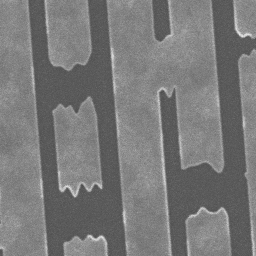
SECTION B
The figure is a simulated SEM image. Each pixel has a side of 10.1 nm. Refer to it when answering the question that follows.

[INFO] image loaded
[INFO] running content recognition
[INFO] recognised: parallel lines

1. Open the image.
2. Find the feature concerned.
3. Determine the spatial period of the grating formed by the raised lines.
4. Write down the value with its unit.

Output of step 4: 631 nm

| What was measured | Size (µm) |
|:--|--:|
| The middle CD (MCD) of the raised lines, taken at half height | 0.429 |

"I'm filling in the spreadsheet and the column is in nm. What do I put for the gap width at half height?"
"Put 199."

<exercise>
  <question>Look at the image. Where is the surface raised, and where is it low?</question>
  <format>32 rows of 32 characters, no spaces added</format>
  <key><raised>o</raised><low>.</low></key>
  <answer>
ooo...ooooo..oooooo..ooooo...ooo
oooo..ooooo...ooooo..ooooo...ooo
oooo..ooooo...ooooo..oooooo..ooo
oooo..ooooo...ooooo..oooooo..ooo
oooo..ooooo...ooooo..oooooo...oo
oooo..ooooo...ooooooooooooo.....
oooo..ooooo...ooooooooooooo.....
oooo..ooooo...ooooooooooooo...oo
oooo....o.....ooooooooooooo...oo
oooo..........ooooooooooooo...oo
oooo..........ooooooooooooo...oo
oooo..........oooooo.oooooo...oo
oooo..........oooooo..ooooo...oo
oooo...oo.oo..oooooo..ooooo...oo
ooooo..ooooo...ooooo..ooooo...oo
ooooo..ooooo...ooooo..oooooo..oo
ooooo..ooooo...ooooo..oooooo..oo
ooooo..ooooo...ooooo..oooooo...o
ooooo..ooooo...ooooo..oooooo...o
ooooo..ooooo...ooooo...ooooo...o
ooooo..ooooo...ooooo...oo.oo...o
ooooo..oooooo..oooooo..........o
ooooo..oooooo..oooooo..........o
ooooo..ooo.....oooooo..........o
ooooo..........oooooo..........o
ooooo..........oooooo..........o
ooooo..........oooooo....o.o...o
oooooo.........oooooo..ooooo...o
oooooo..........ooooo..oooooo..o
oooooo..........ooooo..oooooo..o
oooooo..ooooo...ooooo..oooooo...
oooooo..ooooo...ooooo..oooooo...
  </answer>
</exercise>